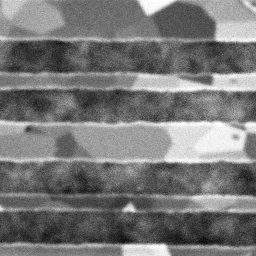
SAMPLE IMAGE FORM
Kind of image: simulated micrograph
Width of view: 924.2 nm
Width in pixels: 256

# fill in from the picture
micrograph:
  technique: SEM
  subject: lines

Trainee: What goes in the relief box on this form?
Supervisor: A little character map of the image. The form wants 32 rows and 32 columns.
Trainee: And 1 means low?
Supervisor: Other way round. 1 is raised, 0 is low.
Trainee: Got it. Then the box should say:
11111111111111111111111111111111
11111111111111111111111111111111
11111111111111111111111111111111
11111111111111111111111111111111
11111111111111111111111111111111
00000000000000000000000000000000
00000000000000000000000000000000
00000000000000000000000000000000
00000000000000000000000000000000
11111111111111111111111111111111
11111111111111111111111111111111
00000000000000000000000000000000
00000000000000000000000000000000
00000000000000000000000000000000
00000000000000000000000000000000
11111011111110011110111111111101
11111111111111111111111111111111
11111111111111111111111111111111
11111111111111111111111111111111
11111111111111111111111111111111
00000000000000000000000000000000
00000000000000000000000000000000
00000000000000000000000000000000
00000000000000000000000000000000
11111111111111111111100001111000
11111111111111111111111111111111
00000000000000000000000000000000
00000000000000000000000000000000
00000000000000000000000000000000
00000000000000000000000000000000
00110000000000000000000000000000
11111111111111111111111111111111